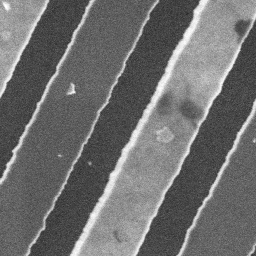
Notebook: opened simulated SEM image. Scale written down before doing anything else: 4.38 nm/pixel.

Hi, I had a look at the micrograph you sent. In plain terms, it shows lines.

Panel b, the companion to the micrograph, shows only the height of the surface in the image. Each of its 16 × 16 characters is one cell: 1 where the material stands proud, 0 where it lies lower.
1110011111001111
1100011110001111
1100111110001110
1000111100011110
1001111100011100
0001111000111100
0011111001111000
0011110001111001
0111110011110001
0111100011110011
1111100111100011
1111000111100111
1111001111000111
1110001111001111
1110011110001111
1100011110011111